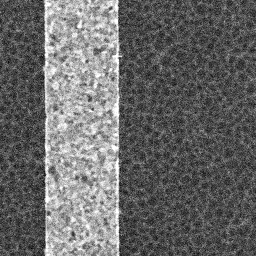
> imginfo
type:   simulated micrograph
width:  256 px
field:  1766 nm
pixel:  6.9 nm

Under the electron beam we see one or a few lines or trenches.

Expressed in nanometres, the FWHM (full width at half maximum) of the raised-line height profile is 503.